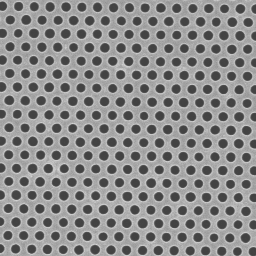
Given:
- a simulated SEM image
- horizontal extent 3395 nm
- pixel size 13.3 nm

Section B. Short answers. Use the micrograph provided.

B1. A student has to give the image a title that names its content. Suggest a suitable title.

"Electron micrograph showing a regular array of holes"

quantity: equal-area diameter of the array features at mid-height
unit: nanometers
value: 117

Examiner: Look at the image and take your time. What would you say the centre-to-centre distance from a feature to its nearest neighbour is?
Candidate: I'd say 204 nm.